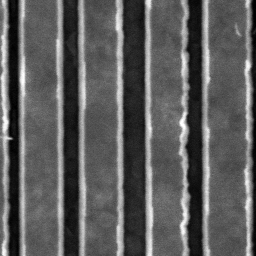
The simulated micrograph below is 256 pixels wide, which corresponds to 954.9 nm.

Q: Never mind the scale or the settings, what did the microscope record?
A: one or a few lines or trenches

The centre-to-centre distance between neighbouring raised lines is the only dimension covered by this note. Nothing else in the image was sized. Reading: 232 nanometers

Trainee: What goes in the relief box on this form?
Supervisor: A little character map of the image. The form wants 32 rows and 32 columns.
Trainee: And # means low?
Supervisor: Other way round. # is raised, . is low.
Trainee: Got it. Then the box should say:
#..#####..#####...#####..######.
#..#####..#####...######..#####.
#..#####..#####...#####...#####.
#..#####..#####...#####..######.
#..#####..#####...#####..######.
#..#####..#####...#####..######.
#..#####..#####...#####..######.
#..#####..#####...#####..######.
#..#####..#####...#####..######.
#..#####..#####...#####..######.
#..#####..#####...#####...#####.
#..#####..#####...#####...#####.
#..#####..#####....####...#####.
#..#####..#####...#####...#####.
#..#####..#####...#####...#####.
#..#####..#####...#####...#####.
#..#####..#####...#####...#####.
#..#####..#####...#####...#####.
#..#####..#####...#####...#####.
#..#####..#####...#####...#####.
#..#####..#####...#####...#####.
#..#####..#####...#####...#####.
#..#####..#####...#####...#####.
#..#####..#####...#####...#####.
#..#####..#####...#####...#####.
#..#####..#####...#####...#####.
#..#####..#####...#####...#####.
#..#####..#####...#####...#####.
#..#####..#####...#####...#####.
#..#####..#####...#####...#####.
#..#####..#####....####...#####.
#..#####..#####...#####...#####.